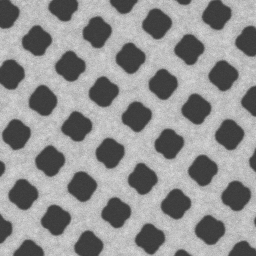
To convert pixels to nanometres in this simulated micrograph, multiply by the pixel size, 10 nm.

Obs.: a regular array of holes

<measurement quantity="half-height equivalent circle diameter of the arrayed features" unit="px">28.5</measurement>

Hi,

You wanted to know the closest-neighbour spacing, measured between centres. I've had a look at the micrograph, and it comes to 420 nm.